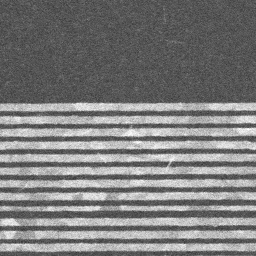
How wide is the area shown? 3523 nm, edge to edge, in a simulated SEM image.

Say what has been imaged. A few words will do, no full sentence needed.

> parallel lines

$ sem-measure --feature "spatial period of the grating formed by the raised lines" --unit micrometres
0.175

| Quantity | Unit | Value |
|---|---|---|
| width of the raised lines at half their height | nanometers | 91.2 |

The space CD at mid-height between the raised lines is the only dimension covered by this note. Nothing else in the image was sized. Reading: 84.3 nm